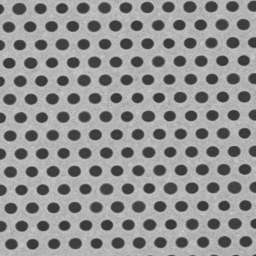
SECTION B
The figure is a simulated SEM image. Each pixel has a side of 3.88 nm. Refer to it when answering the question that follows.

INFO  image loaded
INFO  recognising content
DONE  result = a regular array of holes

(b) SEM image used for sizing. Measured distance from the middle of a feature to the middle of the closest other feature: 80.7 nm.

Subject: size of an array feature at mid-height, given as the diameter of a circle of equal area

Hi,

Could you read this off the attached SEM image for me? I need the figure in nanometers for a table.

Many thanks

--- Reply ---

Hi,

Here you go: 43.9